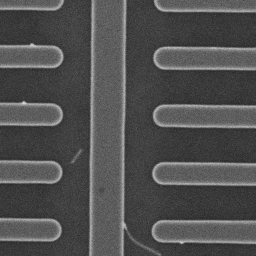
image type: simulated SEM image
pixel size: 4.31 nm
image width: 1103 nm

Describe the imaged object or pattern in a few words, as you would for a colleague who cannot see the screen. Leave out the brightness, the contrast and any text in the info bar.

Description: groups of lines, slits or small figures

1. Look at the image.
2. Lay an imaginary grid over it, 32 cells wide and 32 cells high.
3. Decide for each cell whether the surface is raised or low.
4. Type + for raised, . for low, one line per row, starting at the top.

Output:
++++++++....++++...+++++++++++++
............++++................
............++++................
............++++................
............++++................
............++++................
++++++++....++++....++++++++++++
++++++++....++++...+++++++++++++
............++++....++++++++++++
............++++................
............++++................
...........+++++................
...........+++++................
+++++++....+++++....++++++++++++
++++++++...+++++...+++++++++++++
+++++++....+++++....++++++++++++
...........++++.................
...........++++.................
...........++++.................
...........++++.................
+++++++....++++.....+++++++++++.
++++++++...++++....+++++++++++++
+++++++....++++....+++++++++++++
...........++++.................
...........++++.................
...........++++.................
...........++++.................
+++++++....+++++................
++++++++...++++....+++++++++++++
+++++++....++++....+++++++++++++
...........++++.................
...........++++.................